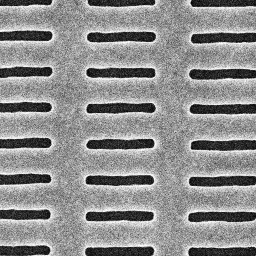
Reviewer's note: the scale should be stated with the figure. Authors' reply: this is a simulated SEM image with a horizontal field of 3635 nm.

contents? holes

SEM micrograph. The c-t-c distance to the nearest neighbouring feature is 508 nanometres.